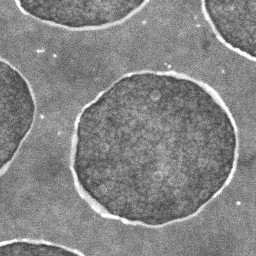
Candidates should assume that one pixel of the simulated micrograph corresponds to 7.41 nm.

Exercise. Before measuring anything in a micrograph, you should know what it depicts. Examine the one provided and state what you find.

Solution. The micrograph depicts holes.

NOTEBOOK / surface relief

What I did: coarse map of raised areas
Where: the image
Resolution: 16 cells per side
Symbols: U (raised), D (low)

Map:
UDDDDDDDDUUUUDDD
UUUUDDDUUUUUUDDD
UUUUUUUUUUUUUUDD
UUUUUUUUUUUUUUUU
DUUUUUUUUUUUUUUU
DDUUUUUDDDDDDUUU
DDUUUUDDDDDDDDUU
DDUUUDDDDDDDDDUU
DDUUUDDDDDDDDDDU
DUUUUDDDDDDDDDDU
UUUUUDDDDDDDDDUU
UUUUUDDDDDDDDDUU
UUUUUUDDDDDDDUUU
UUUUUUUDDDDDUUUU
UUUUUUUUUUUUUUUU
DDDDUUUUUUUUUUUU